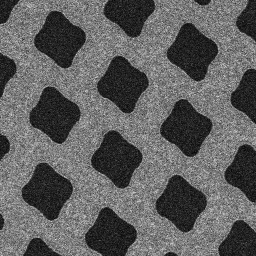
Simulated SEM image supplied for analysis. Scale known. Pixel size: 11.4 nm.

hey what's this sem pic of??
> a regular array of holes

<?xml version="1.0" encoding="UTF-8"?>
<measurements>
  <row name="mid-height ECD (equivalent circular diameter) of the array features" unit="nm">551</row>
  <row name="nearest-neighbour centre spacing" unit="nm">862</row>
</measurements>